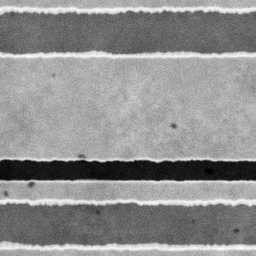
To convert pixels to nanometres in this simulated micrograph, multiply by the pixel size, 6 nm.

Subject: lines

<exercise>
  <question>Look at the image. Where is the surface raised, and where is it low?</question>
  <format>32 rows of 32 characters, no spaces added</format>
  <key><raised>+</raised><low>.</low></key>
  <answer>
++++++++++++++++++++++++++++++++
................................
................................
................................
................................
................................
................................
++++++++++++++++++++++++++++++++
++++++++++++++++++++++++++++++++
++++++++++++++++++++++++++++++++
++++++++++++++++++++++++++++++++
++++++++++++++++++++++++++++++++
++++++++++++++++++++++++++++++++
++++++++++++++++++++++++++++++++
++++++++++++++++++++++++++++++++
++++++++++++++++++++++++++++++++
++++++++++++++++++++++++++++++++
++++++++++++++++++++++++++++++++
++++++++++++++++++++++++++++++++
++++++++++++++++++++++++++++++++
................................
................................
................................
++++++++++++++++++++++++++++++++
++++++++++++++++++++++++++++++++
................................
................................
................................
................................
................................
................................
++++++++++++++++++++++++++++++++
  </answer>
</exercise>